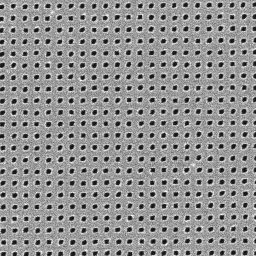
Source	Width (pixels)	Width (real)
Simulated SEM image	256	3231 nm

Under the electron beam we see a regular array of holes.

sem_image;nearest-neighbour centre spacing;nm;141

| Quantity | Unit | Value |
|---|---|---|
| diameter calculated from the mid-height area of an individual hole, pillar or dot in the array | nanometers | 66.8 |